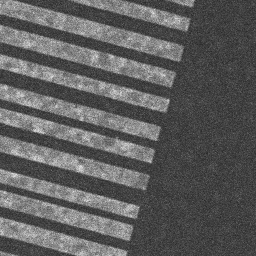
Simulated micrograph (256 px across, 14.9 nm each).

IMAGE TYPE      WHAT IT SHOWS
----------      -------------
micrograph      parallel lines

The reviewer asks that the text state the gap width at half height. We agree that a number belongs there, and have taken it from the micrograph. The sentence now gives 188 nanometers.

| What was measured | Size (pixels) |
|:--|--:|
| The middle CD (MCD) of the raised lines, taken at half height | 13.5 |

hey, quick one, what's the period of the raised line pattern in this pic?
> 400 nm